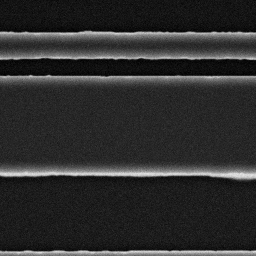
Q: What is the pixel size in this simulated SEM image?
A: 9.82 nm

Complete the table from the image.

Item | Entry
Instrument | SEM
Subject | lines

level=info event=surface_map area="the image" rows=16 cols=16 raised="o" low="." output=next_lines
................
................
oooooooooooooooo
oooooooooooooooo
oooooooooooooooo
oooooooooooooooo
oooooooooooooooo
oooooooooooooooo
oooooooooooooooo
oooooooooooooooo
oooooooooooooooo
................
................
................
................
................